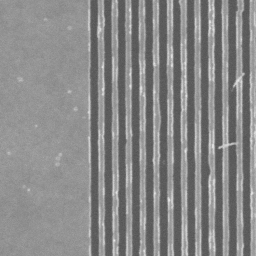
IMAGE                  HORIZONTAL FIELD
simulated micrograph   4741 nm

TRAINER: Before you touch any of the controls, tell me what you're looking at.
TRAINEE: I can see parallel lines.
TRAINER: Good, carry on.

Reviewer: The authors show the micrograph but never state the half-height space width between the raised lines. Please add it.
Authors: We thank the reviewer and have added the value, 164 nanometers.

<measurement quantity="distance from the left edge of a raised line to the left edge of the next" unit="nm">256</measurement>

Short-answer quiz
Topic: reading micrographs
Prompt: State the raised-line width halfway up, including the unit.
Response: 0.0972 um